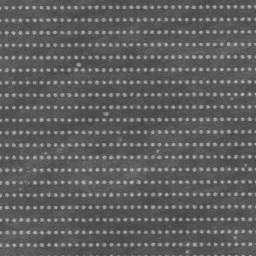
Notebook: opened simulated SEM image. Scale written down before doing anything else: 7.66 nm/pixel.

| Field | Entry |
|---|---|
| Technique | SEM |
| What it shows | a regular array of raised bodies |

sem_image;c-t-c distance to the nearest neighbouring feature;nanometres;52.3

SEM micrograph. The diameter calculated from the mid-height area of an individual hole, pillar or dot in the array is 25.9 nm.